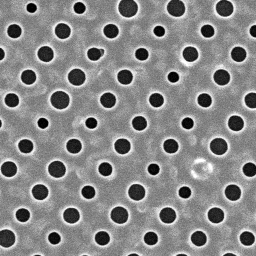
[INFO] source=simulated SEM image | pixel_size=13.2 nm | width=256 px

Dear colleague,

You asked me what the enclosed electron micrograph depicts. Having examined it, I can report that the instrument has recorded a regular array of holes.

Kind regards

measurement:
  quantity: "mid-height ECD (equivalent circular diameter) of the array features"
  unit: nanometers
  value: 204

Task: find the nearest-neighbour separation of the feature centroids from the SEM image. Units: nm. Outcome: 375